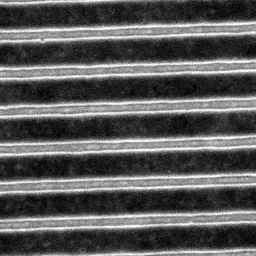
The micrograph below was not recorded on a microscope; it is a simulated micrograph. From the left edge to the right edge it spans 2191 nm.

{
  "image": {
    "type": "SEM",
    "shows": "parallel lines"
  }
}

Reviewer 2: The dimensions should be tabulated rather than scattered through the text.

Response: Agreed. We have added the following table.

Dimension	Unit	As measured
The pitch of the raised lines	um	0.324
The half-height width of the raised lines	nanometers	252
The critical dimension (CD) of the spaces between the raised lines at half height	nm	72.7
